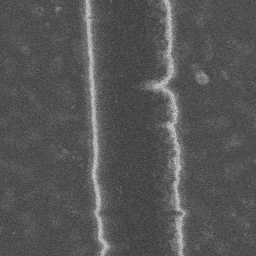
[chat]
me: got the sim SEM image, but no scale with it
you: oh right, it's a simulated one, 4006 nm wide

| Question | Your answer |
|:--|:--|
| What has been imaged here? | one or a few lines or trenches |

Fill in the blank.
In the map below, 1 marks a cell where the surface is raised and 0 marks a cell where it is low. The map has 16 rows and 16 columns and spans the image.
1111100000111111
1111110000011111
1111110000011111
1111110000011111
1111110000011111
1111110000111111
1111110000011111
1111110000011111
1111110000011111
1111110000011111
1111110000011111
1111110000011111
1111110000011111
1111110000011111
1111110000011111
1111111000011111